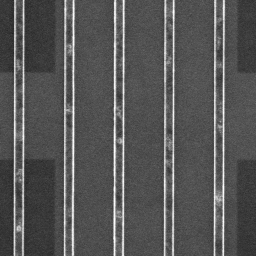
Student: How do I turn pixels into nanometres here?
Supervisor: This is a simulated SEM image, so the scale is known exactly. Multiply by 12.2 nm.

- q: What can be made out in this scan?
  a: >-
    parallel lines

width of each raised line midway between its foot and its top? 114 nm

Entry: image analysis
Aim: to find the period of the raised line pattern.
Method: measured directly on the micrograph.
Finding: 610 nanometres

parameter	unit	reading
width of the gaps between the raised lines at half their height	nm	498